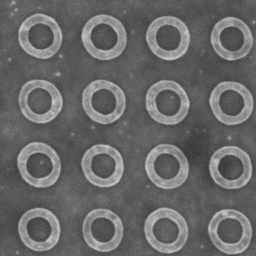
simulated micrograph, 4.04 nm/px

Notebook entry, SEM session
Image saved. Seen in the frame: a regular array of ring-shaped raised bodies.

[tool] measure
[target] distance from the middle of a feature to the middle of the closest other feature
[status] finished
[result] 256 nm